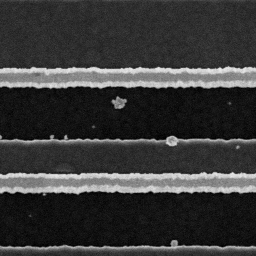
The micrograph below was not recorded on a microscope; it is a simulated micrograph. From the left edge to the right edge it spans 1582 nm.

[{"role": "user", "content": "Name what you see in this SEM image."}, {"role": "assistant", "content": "lines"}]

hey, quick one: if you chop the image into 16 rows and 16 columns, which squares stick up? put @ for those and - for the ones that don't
@@@@@@@@@@@@@@@@
@@@@@@@@@@@@@@@@
@@@@@@@@@@@@@@@@
@@@@@@@@@@@@@@@@
@@@@@@@@@@@@@@@@
----------------
----------------
----------------
----------------
@@@@@@@@@@@@@@@@
@@@@@@@@@@@@@@@@
@@@@@@@@@@@@@@@@
----------------
----------------
----------------
@@-@@@@@@@@@@@@@